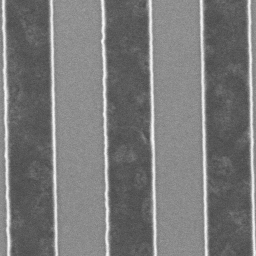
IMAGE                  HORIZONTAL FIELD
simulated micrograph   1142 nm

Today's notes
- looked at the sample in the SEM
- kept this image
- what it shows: one or a few lines or trenches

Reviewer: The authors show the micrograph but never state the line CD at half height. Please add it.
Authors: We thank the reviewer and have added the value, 219 nm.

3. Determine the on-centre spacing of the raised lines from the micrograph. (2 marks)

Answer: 0.441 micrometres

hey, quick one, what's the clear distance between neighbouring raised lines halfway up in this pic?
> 223 nm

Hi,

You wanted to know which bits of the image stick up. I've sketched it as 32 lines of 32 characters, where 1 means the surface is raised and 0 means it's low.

11111100000001111110000001111110
11111100000001111110000001111110
11111100000001111110000001111110
11111110000001111110000001111110
01111110000001111110000001111110
01111110000001111110000001111110
01111110000001111110000001111110
01111110000001111110000001111110
11111110000001111110000001111110
01111110000001111110000001111110
01111110000001111110000001111110
01111110000001111110000001111110
01111110000001111110000001111110
01111110000001111110000001111110
01111110000001111110000001111110
01111110000001111110000001111110
01111110000001111110000001111111
01111110000001111110000001111111
01111110000001111110000001111110
01111110000001111110000001111111
01111110000001111110000000111111
01111110000001111110000000111111
01111110000001111110000000111111
01111110000001111110000000111111
01111110000001111110000000111111
01111110000001111110000000111111
01111110000001111110000000111111
01111110000001111110000000111111
01111110000001111110000000111111
01111110000001111110000000111111
01111110000001111110000000111111
01111110000001111110000000111111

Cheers